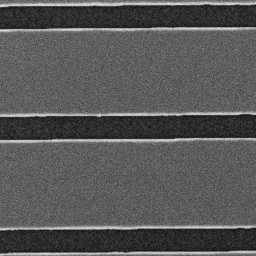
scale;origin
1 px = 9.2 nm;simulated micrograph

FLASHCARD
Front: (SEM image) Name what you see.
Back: lines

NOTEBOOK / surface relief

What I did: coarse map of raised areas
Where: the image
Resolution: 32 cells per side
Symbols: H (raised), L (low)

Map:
HHHHHHHHHHHHHHHHHHHHHHHHHLHHHHHH
LLLLLLLLLLLLLLLLLLLLLLLLLLLLLLLL
LLLLLLLLLLLLLLLLLLLLLLLLLLLLLLLL
LLLLLLLLLLLLLLLLLLLHHHHHHHHHHHHH
HHHHHHHHHHHHHHHHHHHHHHHHHHHHHHHH
HHHHHHHHHHHHHHHHHHHHHHHHHHHHHHHH
HHHHHHHHHHHHHHHHHHHHHHHHHHHHHHHH
HHHHHHHHHHHHHHHHHHHHHHHHHHHHHHHH
HHHHHHHHHHHHHHHHHHHHHHHHHHHHHHHH
HHHHHHHHHHHHHHHHHHHHHHHHHHHHHHHH
HHHHHHHHHHHHHHHHHHHHHHHHHHHHHHHH
HHHHHHHHHHHHHHHHHHHHHHHHHHHHHHHH
HHHHHHHHHHHHHHHHHHHHHHHHHHHHHHHH
HHHHHHHHHHHHHHHHHHHHHHHHHHHHHHHH
HHHHLLLLLLLLHLLLLLLLLLLLLLLLLLLL
LLLLLLLLLLLLLLLLLLLLLLLLLLLLLLLL
LLLLLLLLLLLLLLLLLLLLLLLLLLLLLLLL
LLLLLLLLLHHLHHHHHHHHHHHHHHHHHHHH
HHHHHHHHHHHHHHHHHHHHHHHHHHHHHHHH
HHHHHHHHHHHHHHHHHHHHHHHHHHHHHHHH
HHHHHHHHHHHHHHHHHHHHHHHHHHHHHHHH
HHHHHHHHHHHHHHHHHHHHHHHHHHHHHHHH
HHHHHHHHHHHHHHHHHHHHHHHHHHHHHHHH
HHHHHHHHHHHHHHHHHHHHHHHHHHHHHHHH
HHHHHHHHHHHHHHHHHHHHHHHHHHHHHHHH
HHHHHHHHHHHHHHHHHHHHHHHHHHHHHHHH
HHHHHHHHHHHHHHHHHHHHHHHHHHHHHHHH
HHHHHHHHHHHHHHHHHHHHHHHHHHHHHHHH
HHHHHHHHHHHHHHHHHHHHHHHHHHHHHHHL
LLLLLLLLLLLLLLLLLLLLLLLLLLLLLLLL
LLLLLLLLLLLLLLLLLLLLLLLLLLLLLLLL
LLLLLLLLLLLLLLLLLLLLLLLLLLLLLHHH